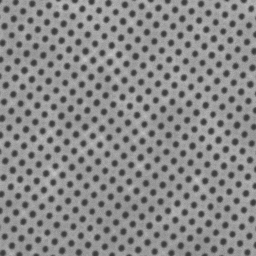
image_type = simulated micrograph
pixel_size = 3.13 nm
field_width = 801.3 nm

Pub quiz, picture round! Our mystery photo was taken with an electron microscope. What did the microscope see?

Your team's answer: a regular array of holes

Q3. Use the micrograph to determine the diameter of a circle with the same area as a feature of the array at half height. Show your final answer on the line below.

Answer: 18.7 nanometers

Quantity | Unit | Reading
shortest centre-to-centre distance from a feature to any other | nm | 36.3